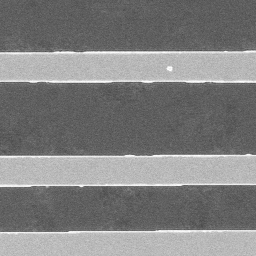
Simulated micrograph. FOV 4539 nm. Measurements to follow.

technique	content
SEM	lines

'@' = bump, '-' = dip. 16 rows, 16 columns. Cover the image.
----------------
----------------
----------------
@@@@@@@@@@@@@@@@
@@@@@@@@@@@@@@@@
----------------
----------------
----------------
----------------
----------------
@@@@@@@@@@@@@@@@
@@@@@@@@@@@@@@@@
----------------
----------------
----@@@@@@@@@@@@
@@@@@@@@@@@@@@@@